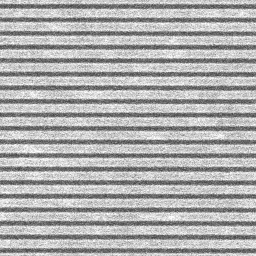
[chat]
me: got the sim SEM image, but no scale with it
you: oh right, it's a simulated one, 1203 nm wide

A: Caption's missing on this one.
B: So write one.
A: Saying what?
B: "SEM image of parallel lines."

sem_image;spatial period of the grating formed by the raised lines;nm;63.7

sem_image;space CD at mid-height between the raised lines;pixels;5.38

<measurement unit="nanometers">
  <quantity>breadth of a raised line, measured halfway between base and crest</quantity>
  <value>37.6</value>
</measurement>